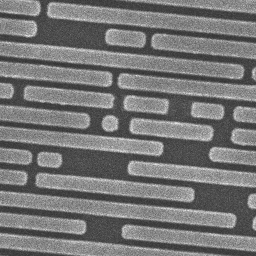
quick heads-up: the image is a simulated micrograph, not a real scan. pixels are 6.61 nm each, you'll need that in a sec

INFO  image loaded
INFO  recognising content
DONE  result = parallel lines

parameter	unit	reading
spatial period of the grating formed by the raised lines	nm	141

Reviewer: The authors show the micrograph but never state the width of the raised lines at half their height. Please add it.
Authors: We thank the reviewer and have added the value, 97.1 nm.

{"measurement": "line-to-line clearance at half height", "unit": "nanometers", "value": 46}